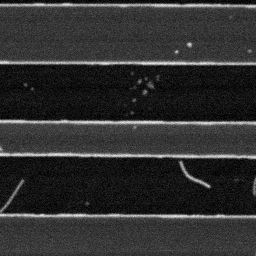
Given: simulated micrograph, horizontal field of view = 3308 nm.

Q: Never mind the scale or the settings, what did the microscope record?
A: lines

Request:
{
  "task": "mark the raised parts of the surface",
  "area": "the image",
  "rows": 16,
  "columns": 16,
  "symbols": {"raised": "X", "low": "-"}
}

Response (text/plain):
XXXXXXXXXXXXXXXX
XXXXXXXXXXXXXXXX
XXXXXXXXXXXXXXXX
XXXXXXXXXXXXXXXX
----------------
----------------
----------------
----------------
XXXXXXXXXXXXXXXX
XXXXXXXXXXXXXXXX
----------------
----------------
----------------
XXXXXXXXXX------
XXXXXXXXXXXXXXXX
XXXXXXXXXXXXXXXX